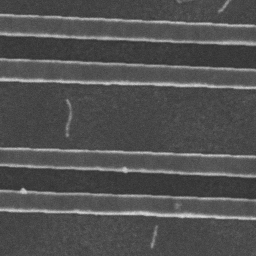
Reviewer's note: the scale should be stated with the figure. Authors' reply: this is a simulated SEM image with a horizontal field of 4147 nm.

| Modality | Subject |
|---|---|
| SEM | lines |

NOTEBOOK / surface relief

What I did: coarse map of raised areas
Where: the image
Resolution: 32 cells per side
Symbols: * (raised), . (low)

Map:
................................
................................
***************.................
********************************
.....***************************
............................****
................................
****............................
***************************.....
********************************
...............*****************
................................
................................
................................
................................
................................
................................
................................
................................
*****************************...
********************************
...............*..**************
................................
................................
*******************.............
********************************
.....***************************
................................
................................
................................
................................
................................